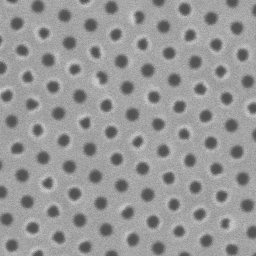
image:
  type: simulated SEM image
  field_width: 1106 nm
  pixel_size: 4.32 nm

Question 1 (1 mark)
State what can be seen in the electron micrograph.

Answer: a regular array of holes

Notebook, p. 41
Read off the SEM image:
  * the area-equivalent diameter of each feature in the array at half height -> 12.6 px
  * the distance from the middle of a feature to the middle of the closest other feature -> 116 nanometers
